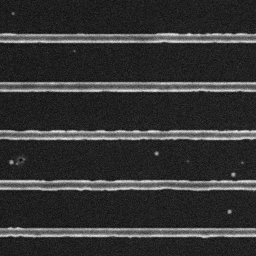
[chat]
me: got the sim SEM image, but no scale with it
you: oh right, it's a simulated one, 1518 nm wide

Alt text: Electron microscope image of lines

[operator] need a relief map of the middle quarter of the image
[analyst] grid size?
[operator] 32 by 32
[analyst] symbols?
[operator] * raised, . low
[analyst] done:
................................
................................
................................
................................
................................
********************************
********************************
................................
................................
................................
................................
................................
................................
................................
................................
................................
................................
********************************
********************************
................................
................................
................................
................................
................................
................................
................................
................................
................................
................................
********************************
********************************
................................